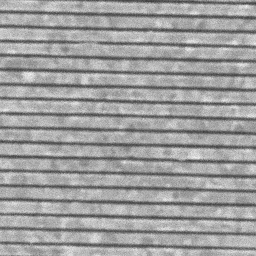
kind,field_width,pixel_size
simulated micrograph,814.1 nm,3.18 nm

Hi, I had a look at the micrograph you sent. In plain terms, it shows parallel lines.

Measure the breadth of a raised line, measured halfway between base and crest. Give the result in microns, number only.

0.035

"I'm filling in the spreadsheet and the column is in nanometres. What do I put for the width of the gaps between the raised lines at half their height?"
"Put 11.5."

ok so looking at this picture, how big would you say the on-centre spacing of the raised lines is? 45.9 nanometres